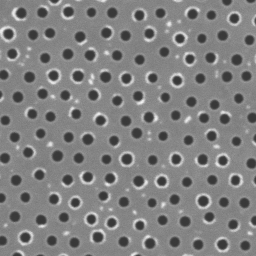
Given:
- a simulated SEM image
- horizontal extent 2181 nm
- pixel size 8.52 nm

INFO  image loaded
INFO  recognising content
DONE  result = a regular array of holes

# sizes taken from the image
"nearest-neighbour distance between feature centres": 177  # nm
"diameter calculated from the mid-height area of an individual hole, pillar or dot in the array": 88.6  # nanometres